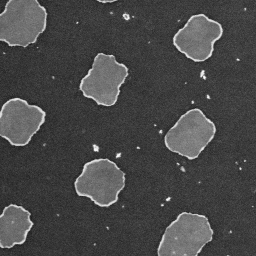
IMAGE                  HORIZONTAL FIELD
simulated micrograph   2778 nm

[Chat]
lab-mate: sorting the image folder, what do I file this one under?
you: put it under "raised bodies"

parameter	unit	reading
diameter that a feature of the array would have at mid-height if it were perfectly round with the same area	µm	0.487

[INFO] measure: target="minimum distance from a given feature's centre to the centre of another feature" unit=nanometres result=1080